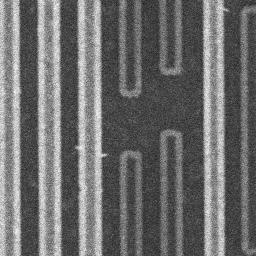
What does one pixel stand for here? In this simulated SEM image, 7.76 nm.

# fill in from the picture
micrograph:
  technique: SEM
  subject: parallel lines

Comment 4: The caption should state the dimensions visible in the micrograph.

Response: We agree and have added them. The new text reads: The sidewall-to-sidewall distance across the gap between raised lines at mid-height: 24 pixels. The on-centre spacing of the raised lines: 319 nm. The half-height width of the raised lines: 0.127 micrometres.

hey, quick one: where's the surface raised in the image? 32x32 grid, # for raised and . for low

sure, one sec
##...##...##...##...##....##....
##...##...##...##...##....##...#
##...##...##...##...##....##..##
##...##...##...##...##....##..##
##...##...##...##...##....##..##
##...##...##...##...##....##..##
##...##...##...##...##....##..##
##...##...##...##...##....##..##
##...##...##...##...##....##..##
##...##...##...##.........##..##
##...##...##...##.........##..##
##...##...##...##.........##..##
##...##...##..............##..##
##...##...##..............##..##
##...##...##..............##..##
##...##...##..............##..##
##...##...##..............##..##
##...##...##........##....##..##
##...##...##........##....##..##
##...##...##...##...##....##..##
##...##...##...##...##....##..##
##...##...##...##...##....##...#
##...##...##...##...##....##...#
##...##...##...##...##....##...#
##...##...##...##...##....##...#
##...##...##...##...##....##...#
##...##...##...##...##....##...#
##...##...##...##...##....##...#
##...##...##...##...##....##...#
##...##...##...##...##....##...#
##...##...##...##...##....##...#
##...##...##...##...##....##...#